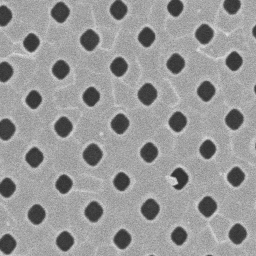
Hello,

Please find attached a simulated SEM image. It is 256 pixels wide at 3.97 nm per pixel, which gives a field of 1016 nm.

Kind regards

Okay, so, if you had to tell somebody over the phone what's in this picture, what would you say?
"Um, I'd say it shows a regular array of holes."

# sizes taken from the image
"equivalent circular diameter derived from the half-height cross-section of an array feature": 71.5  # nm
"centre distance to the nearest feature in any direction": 157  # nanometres